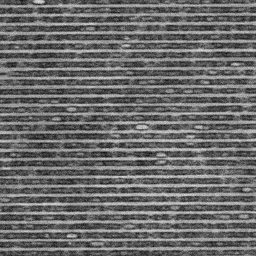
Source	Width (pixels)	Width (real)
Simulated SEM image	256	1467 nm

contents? parallel lines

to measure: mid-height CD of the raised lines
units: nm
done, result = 10.8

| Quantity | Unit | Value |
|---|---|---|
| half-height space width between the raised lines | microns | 0.0401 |